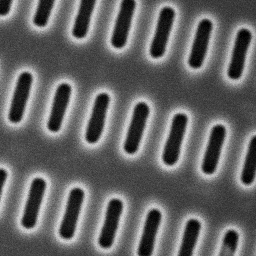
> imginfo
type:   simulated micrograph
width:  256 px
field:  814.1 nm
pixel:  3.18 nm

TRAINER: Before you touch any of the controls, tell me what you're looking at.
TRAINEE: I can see a regular array of holes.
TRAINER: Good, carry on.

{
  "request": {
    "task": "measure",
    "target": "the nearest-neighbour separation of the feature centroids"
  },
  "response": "0.127 um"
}